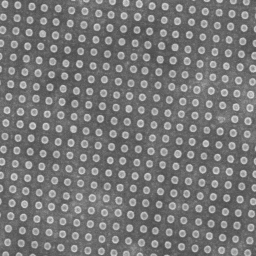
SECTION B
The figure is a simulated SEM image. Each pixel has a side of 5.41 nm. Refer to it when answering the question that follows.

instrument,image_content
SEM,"a regular array of raised bodies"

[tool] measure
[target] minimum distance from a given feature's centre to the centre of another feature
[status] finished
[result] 68.8 nm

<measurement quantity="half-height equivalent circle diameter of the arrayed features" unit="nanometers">36.1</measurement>